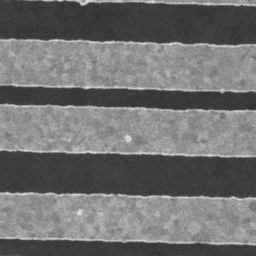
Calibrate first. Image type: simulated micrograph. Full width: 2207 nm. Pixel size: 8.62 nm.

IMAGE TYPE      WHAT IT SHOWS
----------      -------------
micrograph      lines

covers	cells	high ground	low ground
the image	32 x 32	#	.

..........#.............########
................................
................................
................................
................................
###################..##.........
################################
################################
################################
################################
################################
................................
................................
#############...................
################################
################################
################################
################################
################################
...........................#####
................................
................................
................................
................................
################................
################################
################################
################################
################################
################################
...............................#
................................